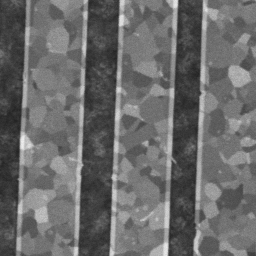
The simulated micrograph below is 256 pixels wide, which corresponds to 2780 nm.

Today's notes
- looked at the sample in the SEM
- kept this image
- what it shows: one or a few lines or trenches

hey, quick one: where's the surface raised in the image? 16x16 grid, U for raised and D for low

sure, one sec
DDUUUDDDUUUDDUUU
DDUUUDDDUUUDDUUU
DDUUUDDDUUUDDUUU
DDUUUDDDUUUDDUUU
DDUUUDDUUUUDDUUU
DDUUUDDUUUUDDUUU
DDUUUDDUUUUDDUUU
DUUUUDDUUUUDDUUU
DUUUUDDUUUUDDUUU
DUUUUDDUUUUDUUUU
DUUUUDDUUUUDUUUU
DUUUUDDUUUUDUUUU
DUUUUDDUUUDDUUUU
DUUUUDDUUUDDUUUU
DUUUUDDUUUDDUUUU
DUUUUDDUUUDDUUUU